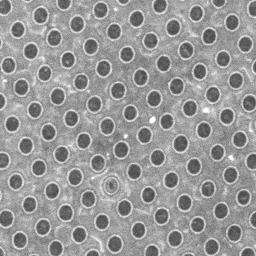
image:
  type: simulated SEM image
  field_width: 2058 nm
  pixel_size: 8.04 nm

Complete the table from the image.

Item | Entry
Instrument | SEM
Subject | a regular array of raised bodies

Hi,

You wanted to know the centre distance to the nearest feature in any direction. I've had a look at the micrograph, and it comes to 0.207 um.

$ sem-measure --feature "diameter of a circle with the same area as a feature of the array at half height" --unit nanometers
127